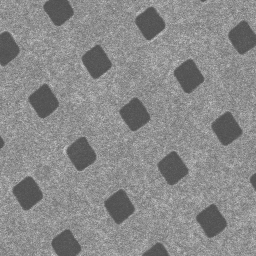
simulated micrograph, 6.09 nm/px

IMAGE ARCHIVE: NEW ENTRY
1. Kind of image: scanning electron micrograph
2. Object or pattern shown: a regular array of holes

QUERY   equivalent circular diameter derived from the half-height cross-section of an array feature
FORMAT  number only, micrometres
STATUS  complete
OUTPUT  0.172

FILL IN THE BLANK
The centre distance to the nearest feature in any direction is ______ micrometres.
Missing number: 0.397